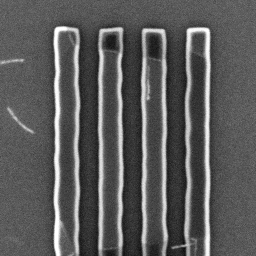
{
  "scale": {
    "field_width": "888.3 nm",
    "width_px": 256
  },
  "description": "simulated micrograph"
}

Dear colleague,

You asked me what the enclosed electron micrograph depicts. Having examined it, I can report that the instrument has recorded groups of lines, slits or small figures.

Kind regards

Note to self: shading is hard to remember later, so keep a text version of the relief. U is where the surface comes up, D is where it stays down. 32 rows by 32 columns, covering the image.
DDDDDDDDDDDDDDDDDDDDDDDDDDDDDDDD
DDDDDDDDDDDDDDDDDDDDDDDDDDDDDDDD
DDDDDDDDDDDDDDDDDDDDDDDDDDDDDDDD
DDDDDDDDDDDDDDDDDDDDDDDDDDDDDDDD
DDDDDDDUUUDDDUUDDDUUUDDDUUDDDDDD
DDDDDDDUUUDDDUUDDDUUUDDDUUDDDDDD
DDDDDDDUUUDDDUUDDDUUUDDDUUDDDDDD
DDDDDDDUUUDDDUUDDDUUUDDDUUDDDDDD
DDDDDDDUUUDDDUUDDDUUUDDDUUDDDDDD
DDDDDDDUUUDDDUUDDDUUUDDDUUDDDDDD
DDDDDDDUUUDDDUUDDDUUUDDDUUDDDDDD
DDDDDDDUUUDDDUUDDDUUUDDUUUDDDDDD
DDDDDDDUUUDDDUUDDDUUUDDUUUDDDDDD
DDDDDDDUUUDDDUUDDDUUUDDUUUDDDDDD
DDDDDDDUUUDDDUUDDDUUUDDUUUDDDDDD
DDDDDDDUUUDDDUUDDDUUUDDDUUDDDDDD
DDDDDDDUUUDDDUUDDDUUUDDUUUDDDDDD
DDDDDDDUUUDDDUUDDDUUUDDUUUDDDDDD
DDDDDDDUUUDDDUUDDDUUUDDDUUDDDDDD
DDDDDDDUUUDDDUUDDDUUUDDDUUDDDDDD
DDDDDDDUUUDDDUUDDDUUUDDUUUDDDDDD
DDDDDDDUUUDDDUUDDDUUUDDDUUDDDDDD
DDDDDDDUUUDDDUUDDDUUUDDDUUDDDDDD
DDDDDDDUUUDDDUUDDDUUUDDDUUDDDDDD
DDDDDDDUUUDDDUUDDDUUUDDDUUDDDDDD
DDDDDDDUUUDDDUUDDDUUUDDUUUDDDDDD
DDDDDDDUUUDDDUUDDDUUUDDUUUDDDDDD
DDDDDDDUUUDDDUUDDDUUUDDUUUDDDDDD
DDDDDDDUUUDDDUUDDDUUUDDUUUDDDDDD
DDDDDDDUUUDDDUUDDDUUUDDUUUDDDDDD
DDDDDDDUUUDDDUUDDDUUUDDUUUDDDDDD
DDDDDDDUUUDDDUUDDDUUUDDDUUDDDDDD